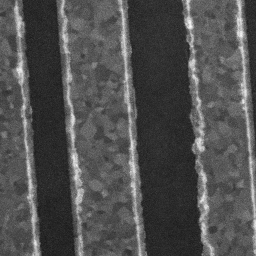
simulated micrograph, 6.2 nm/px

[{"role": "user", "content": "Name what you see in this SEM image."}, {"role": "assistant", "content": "one or a few lines or trenches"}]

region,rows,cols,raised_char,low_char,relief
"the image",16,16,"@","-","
@---@@@@----@@@-
@---@@@@----@@@-
@---@@@@----@@@-
@---@@@@----@@@-
@---@@@@----@@@-
@---@@@@----@@@-
@@--@@@@----@@@-
@@---@@@-----@@-
@@---@@@-----@@@
@@---@@@----@@@@
@@---@@@-----@@@
@@---@@@-----@@@
@@---@@@-----@@@
@@---@@@@----@@@
@@---@@@@----@@@
@@---@@@@----@@@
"